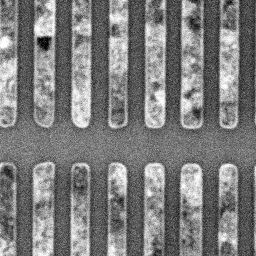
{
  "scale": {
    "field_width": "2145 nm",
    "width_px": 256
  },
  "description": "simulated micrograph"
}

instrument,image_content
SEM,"wiring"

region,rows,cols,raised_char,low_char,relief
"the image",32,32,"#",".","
##...##..##...##..###..##...##..
##...##..##...##..###..##...##..
##..###..##...##..###..##...##..
##..###..##...##..###..##...##..
##..###..##...##..###..##...##..
##..###..##...##..###..##...##..
##..###..##...##..##...##...##..
##..###..##...##..##...##...##..
##..###..##...##..##...##...##..
##..###..##...##..##...##...##..
##..###..##...##..##...##...##..
##..###..##...##..##...##...##..
##..###..##...##..##...##...##..
##..###..##...##..##...##...##..
##..###..##...##..##...##...##..
#....#....#...##..##...##...##..
................................
................................
................................
................................
.....#..........................
##..###..##...##..##...##...##..
##..###..##...##..##...##...##..
##..###..##...##..##...##...##..
##..###..##...##..##...##..###..
##..###..##...##..##...##..###..
##..###..##...##..##...##..###..
##..###..##...##..##...##..###..
##..###..##...##..##...##..###..
##..###..##...##..##...##..###..
##..##...##...##..##...##..###..
##..##...##...##..##...##..###..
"